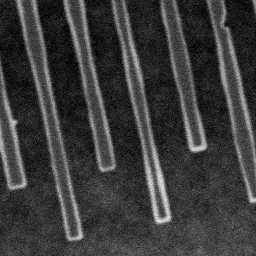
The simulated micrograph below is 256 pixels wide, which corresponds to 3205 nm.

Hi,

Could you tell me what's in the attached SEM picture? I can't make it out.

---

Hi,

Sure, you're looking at parallel lines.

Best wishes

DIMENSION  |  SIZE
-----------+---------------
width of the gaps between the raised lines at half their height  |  404 nm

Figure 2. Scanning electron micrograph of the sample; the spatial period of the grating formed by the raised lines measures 579 nm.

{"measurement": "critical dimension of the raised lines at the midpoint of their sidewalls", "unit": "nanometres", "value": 167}